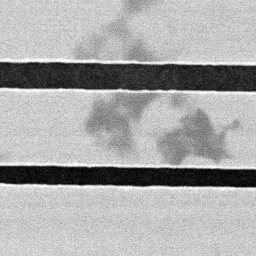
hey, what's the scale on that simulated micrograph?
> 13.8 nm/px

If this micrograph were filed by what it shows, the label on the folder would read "lines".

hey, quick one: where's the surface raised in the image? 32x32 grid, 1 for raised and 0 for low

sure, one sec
11111111111111111111111111111111
11111111111111111111111111111111
11111111111111111111111111111111
11111111111111111111111111111111
11111111111111111111111111111111
11111111111111111111111111111111
11111111111111111111111111111111
11111111111111111111111111111111
00000000000000000000000000000000
00000000000000000000000000000000
00000000000000000000000000000000
11111111111111111111111111111111
11111111111111111111111111111111
11111111111111111111111111111111
11111111111111111111111111111111
11111111111111111111111111111111
11111111111111111111111111111111
11111111111111111111111111111111
11111111111111111111111111111111
11111111111111111111111111111111
11111111111111111111111111111111
00000000000000000000000000000000
00000000000000000000000000000000
11111111111111111111111111111111
11111111111111111111111111111111
11111111111111111111111111111111
11111111111111111111111111111111
11111111111111111111111111111111
11111111111111111111111111111111
11111111111111111111111111111111
11111111111111111111111111111111
11111111111111111111111111111111